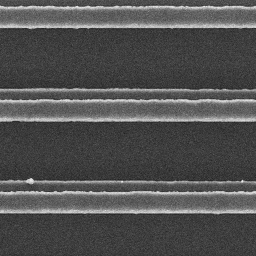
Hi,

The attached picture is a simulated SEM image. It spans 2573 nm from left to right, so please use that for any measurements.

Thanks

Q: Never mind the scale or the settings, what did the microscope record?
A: lines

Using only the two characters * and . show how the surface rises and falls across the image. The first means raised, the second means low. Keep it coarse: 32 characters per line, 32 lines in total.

********************************
********************************
********************************
................................
................................
................................
................................
................................
................................
................................
................................
********************************
********************************
********************************
********************************
................................
................................
................................
................................
................................
................................
................................
...*............................
********************************
********************************
********************************
********************************
................................
................................
................................
................................
................................